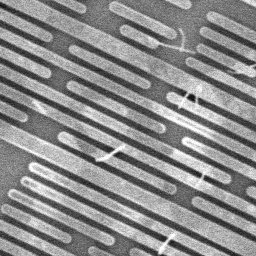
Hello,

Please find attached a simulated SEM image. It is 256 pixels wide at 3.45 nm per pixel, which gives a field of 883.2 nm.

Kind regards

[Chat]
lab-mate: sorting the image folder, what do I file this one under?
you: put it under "groups of lines, slits or small figures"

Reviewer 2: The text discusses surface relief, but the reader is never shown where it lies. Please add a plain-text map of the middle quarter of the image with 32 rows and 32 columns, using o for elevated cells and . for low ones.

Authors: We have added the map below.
oooo....oooooo....ooooooooo....o
.ooooo....ooooo.....ooooooooo...
...ooooo....oooooo....ooooooooo.
.....ooooo....ooooo.....oooooooo
.oo....ooooo.....oooo.....oooooo
.oooo....ooooo.....oo.......oooo
.oooooo....ooooo..............oo
....ooooo....ooooo........oo....
o....oooooo....ooooo......ooooo.
oooo....ooooo.....oooo.....ooooo
oooooo....ooooo.....ooooo...oooo
..oooooo....ooooo.....oooo.....o
....oooooo....ooooo.....oooo....
oo....ooooo.....ooooo.....oooo..
oooo.....ooooo....ooooo.....oooo
.ooooo.....ooooo....ooooo......o
...ooooo.....ooooo....ooo.......
o....ooooo.....ooooo............
ooo....ooooo.....ooooo..........
ooooo....oooooo....ooooo......oo
.oooooo.....ooooo....ooooo.....o
....ooooo....ooooo.....ooooo....
oo....oooooo....ooooo....ooooo..
oooo....ooooo.....ooooo....ooooo
oooooo....ooooo.....ooooo....ooo
oooooooo....ooooo.....ooooo....o
.ooooooooo....ooooo.....ooooo...
...ooooooooo....ooooo.....oooooo
.....ooooooooo....ooooo.....oooo
ooo....ooooooooo.....ooooo....oo
ooooo....ooooooooo....oooooo...o
..ooooo....ooooooooo.....ooo....